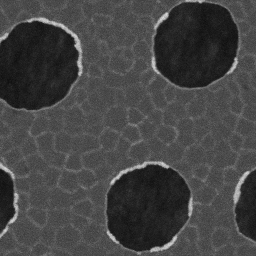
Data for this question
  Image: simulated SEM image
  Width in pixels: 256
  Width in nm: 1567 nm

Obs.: holes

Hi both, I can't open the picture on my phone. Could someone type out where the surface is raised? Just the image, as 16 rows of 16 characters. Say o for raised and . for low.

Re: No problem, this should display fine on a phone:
ooooooooooo...oo
o..ooooooo.....o
.....ooooo.....o
.....ooooo.....o
.....ooooo....oo
....oooooooooooo
o..ooooooooooooo
oooooooooooooooo
oooooooooooooooo
oooooooooooooooo
ooooooooo.oooooo
.oooooo.....ooo.
.oooooo.....ooo.
.oooooo.....ooo.
ooooooo....oooo.
oooooooo..oooooo